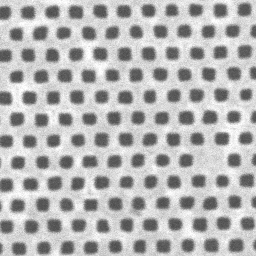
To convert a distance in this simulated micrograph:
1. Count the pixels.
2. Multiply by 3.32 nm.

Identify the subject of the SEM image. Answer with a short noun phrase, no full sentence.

a regular array of holes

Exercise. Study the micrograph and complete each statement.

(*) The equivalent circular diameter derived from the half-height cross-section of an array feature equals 0.0513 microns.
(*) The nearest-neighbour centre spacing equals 78.2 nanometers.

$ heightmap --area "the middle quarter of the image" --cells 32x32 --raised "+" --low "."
++++++++++++++++++++++++++++++++
..+++...++...++++...++....++....
..++....++....++....++....++....
..++....++....++....++....++....
..+++...+++..++++..+++++.++++.++
++++++++++++++++++++++++++++++++
++..+++++..+++++++++...+++...+++
+....+++...+++...+++...+++...++.
+....+++...++....+++...+++...++.
++...+++...+++...+++...+++...+++
++++++++++++++++++++++++++++++++
++++++++++++++++++.+++++++++++++
..+++...+++...+++...+++...+++...
..++....+++...+++...++....+++...
..++....+++...+++...+++...+++...
..++++++++++++++++++++++++++++++
++++++++++++++++++++++++++++++++
++...+++...+++...+++...+++...+++
++...++....++....+++...+++...+++
++...++....+++...++....+++...+++
++...+++...+++...+++..++++..++++
++++++++++++++++++++++++++++++++
+++++++++++++++++...+++..+++++..
..+++...+++...+++...+++....++...
...+.....++...+++...+++....++...
..++....+++...+++...++++..+++...
.+++++++++++++++++++++++++++++++
++++++++++++++++++++++++++++++++
++...+++...+++...+++....++...+++
++...++....+++...+++....++...+++
++...++....+++...+++...+++...+++
++..++++++++++++++++++++++++++++